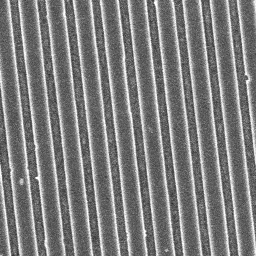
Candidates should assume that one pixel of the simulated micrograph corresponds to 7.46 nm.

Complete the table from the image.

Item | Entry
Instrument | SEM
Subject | parallel lines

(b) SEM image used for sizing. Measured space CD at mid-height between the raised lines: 68.5 nm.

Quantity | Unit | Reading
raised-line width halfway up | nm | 131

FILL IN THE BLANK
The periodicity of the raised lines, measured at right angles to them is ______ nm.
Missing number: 203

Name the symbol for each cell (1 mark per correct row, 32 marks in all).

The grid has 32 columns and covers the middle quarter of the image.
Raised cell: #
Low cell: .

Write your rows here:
##..#####..####...####...####...
##..#####..####...####...####...
##...####..####...####...####...
##...####..#####..####...####...
##...####..#####..#####..#####..
##...####...####...####..#####..
##...####...####...####..#####..
##...####...####...####..#####..
###..####...####...####...####..
###..#####..####...####...####..
###..#####..####...####...####..
###...####..####...####...####..
###...####..#####..#####..####..
###...####..#####..#####..#####.
###...####...####...####..#####.
###...####...####...####..#####.
###...####...####...####..#####.
####..####...####...####...####.
####..#####..#####..####...####.
####..#####..#####..####...####.
####...####..#####..####...####.
####...####..#####..#####..####.
####...####...####..#####..#####
####...####...####...####..#####
####...####...####...####..#####
####...####...####...####..#####
#####..####...####...####...####
#####..#####..#####..####...####
.####..#####..#####..####...####
.####...####..#####..####...####
.####...####..#####..#####..####
.####...####...####..#####..####